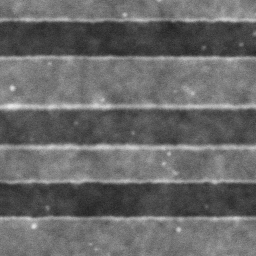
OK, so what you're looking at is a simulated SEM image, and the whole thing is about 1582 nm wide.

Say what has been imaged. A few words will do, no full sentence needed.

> lines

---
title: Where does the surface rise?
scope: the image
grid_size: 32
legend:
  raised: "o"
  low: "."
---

oooooooooooooooooooooooooooooooo
oooooooooooooooooooooooooooooooo
oooooooooooooooooooo.ooooooooooo
................................
................................
................................
................................
oooooooooooooooooooooooooooooooo
oooooooooooooooooooooooooooooooo
oooooooooooooooooooooooooooooooo
oooooooooooooooooooooooooooooooo
oooooooooooooooooooooooooooooooo
oooooooooooooooooooooooooooooooo
................................
................................
................................
................................
................................
ooooooooooo.oooooooooooo.ooooooo
oooooooooooooooooooooooooooooooo
oooooooooooooooooooooooooooooooo
oooooooooooooooooooooooooooooooo
oooooooooooooooooooooooooooooooo
................................
................................
................................
................................
oooooooooooooooooooooooooooooooo
oooooooooooooooooooooooooooooooo
oooooooooooooooooooooooooooooooo
oooooooooooooooooooooooooooooooo
oooooooooooooooooooooooooooooooo